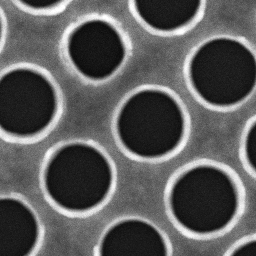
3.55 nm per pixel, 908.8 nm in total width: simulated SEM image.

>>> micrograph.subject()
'holes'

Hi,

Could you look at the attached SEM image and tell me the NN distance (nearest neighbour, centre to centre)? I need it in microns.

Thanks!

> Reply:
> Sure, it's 0.324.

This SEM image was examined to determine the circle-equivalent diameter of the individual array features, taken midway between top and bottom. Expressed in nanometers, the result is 238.